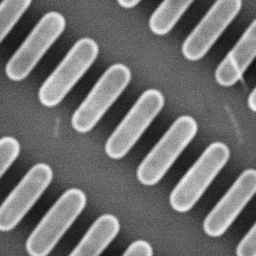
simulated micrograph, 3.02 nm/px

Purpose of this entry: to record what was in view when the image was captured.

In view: groups of lines, slits or small figures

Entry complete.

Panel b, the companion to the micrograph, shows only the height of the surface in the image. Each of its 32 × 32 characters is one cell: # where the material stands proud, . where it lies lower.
####...........##...####...###..
###................####...####..
##...###...........###...####...
#...####...........##...####...#
#...###.................###...##
...###....##...........####...##
..####...###...........###...###
.####...####................####
.###...####...##...........####.
.##...####...###...........###..
......###...####............#...
.....###...####...##............
.....###...###...###...........#
..........###....###...........#
.........####...###.............
.........###...####...##........
..............####...###........
##............###...####........
##...........###...####...##....
##............#...####...###....
#.................###...####....
....##...........####...###....#
...###............##...###....##
..####................####...###
.####...##...........####...###.
####...####...........##...####.
###...####................####..
##...####...##............###...
#....###...####...........##....
....####...###.................#
...####...####...#............##
....##...####...###...........##